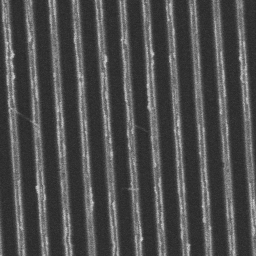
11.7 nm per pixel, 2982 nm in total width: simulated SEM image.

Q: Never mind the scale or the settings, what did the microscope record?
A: parallel lines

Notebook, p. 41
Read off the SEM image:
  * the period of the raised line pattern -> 272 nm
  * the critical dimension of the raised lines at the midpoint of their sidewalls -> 112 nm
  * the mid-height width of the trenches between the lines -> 14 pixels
